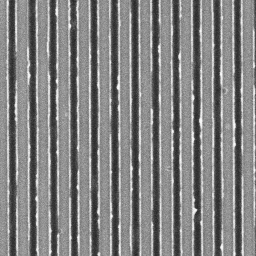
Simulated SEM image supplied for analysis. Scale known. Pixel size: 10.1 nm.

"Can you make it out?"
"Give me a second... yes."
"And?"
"parallel lines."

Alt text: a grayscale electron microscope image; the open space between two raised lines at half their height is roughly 106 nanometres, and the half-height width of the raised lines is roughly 0.0994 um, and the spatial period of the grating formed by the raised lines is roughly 0.207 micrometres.